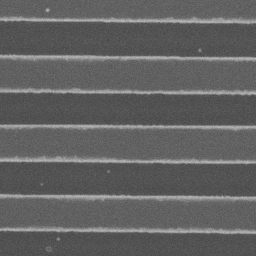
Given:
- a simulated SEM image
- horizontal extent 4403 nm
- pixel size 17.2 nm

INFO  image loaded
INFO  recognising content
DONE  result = lines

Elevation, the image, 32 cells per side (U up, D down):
UUUUUUUUUUUUUUUUUUUUUUUUUUUUUUUU
UUUUUUUUUUUUUUUUUUUUUUUUUUUUUUUU
UDDUUUUUUUUUUUUUUUUUUUUUUUUUUUUU
DDDDDDDDDDDDDDDDDDDDDDDDDDDDDDDD
DDDDDDDDDDDDDDDDDDDDDDDDDDDDDDDD
DDDDDDDDDDDDDDDDDDDDDDDDDDDDDDDD
DDDDDDDDDDDDDDDDDDDDDDDDDDDDDDDD
UUUUUUUUUUUUUUUUUUUUUUUUUUUUUUUU
UUUUUUUUUUUUUUUUUUUUUUUUUUUUUUUU
UUUUUUUUUUUUUUUUUUUUUUUUUUUUUUUU
UUUUUUUUUUUUUUUUUUUUUUUUUUUUUUUU
DDDDUDDUUUUUUUUUUUUUUUUUUUUUUUUU
DDDDDDDDDDDDDDDDDDDDDDDDDDDDDDDD
DDDDDDDDDDDDDDDDDDDDDDDDDDDDDDDD
DDDDDDDDDDDDDDDDDDDDDDDDDDDDDDDD
DDDDDDDDDDDDDDDDDDDDDDDDDDDDDDDD
UUUUUUUUUUUUUUUUUUUUUUUUUUUUUUUU
UUUUUUUUUUUUUUUUUUUUUUUUUUUUUUUU
UUUUUUUUUUUUUUUUUUUUUUUUUUUUUUUU
UUUUUUUUUUUUUUUUUUUUUUUUUUUUUUUU
DDDDDDDDDDDDDDDDDDDDDDDDDDDDDDDD
DDDDDDDDDDDDDDDDDDDDDDDDDDDDDDDD
DDDDDDDDDDDDDDDDDDDDDDDDDDDDDDDD
DDDDDDDDDDDDDDDDDDDDDDDDDDDDDDDD
UUUUUUUUUUUUUDDDDDDDDDDDDDDDDDDD
UUUUUUUUUUUUUUUUUUUUUUUUUUUUUUUU
UUUUUUUUUUUUUUUUUUUUUUUUUUUUUUUU
UUUUUUUUUUUUUUUUUUUUUUUUUUUUUUUU
UUUUUUUUUUUUUUUUUUUUUUUUUUUUUUUU
DDDDDDDDDDDDDDDDDDDDDDDDDDDDDDDD
DDDDDDDDDDDDDDDDDDDDDDDDDDDDDDDD
DDDDDDDDDDDDDDDDDDDDDDDDDDDDDDDD